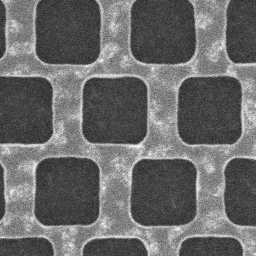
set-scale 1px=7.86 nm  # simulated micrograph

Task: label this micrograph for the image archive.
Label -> holes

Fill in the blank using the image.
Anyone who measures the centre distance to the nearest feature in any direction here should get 740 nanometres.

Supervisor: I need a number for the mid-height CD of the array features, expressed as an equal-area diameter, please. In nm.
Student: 580